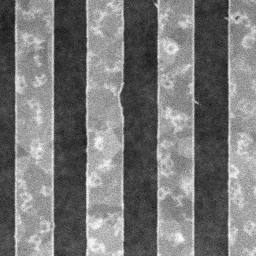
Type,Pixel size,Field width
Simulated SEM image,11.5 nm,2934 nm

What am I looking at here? one or a few lines or trenches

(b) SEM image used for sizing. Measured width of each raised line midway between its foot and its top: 35.9 px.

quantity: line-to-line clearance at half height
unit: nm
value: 403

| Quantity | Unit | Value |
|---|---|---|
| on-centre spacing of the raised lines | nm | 806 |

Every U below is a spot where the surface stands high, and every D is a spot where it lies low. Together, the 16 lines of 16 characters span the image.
DUUDDUUUDDUUDDUU
DUUDDUUUDDUUDDUU
DUUDDUUUDDUUDDUU
DUUDDUUUDDUUDDUU
DUUDDUUUDDUUDDUU
DUUDDUUUDDUUDDUU
DUUDDUUUDDUUDDUU
DUUDDUUUDDUUDDUU
DUUDDUUUDDUUDDUU
DUUDDUUUDDUUDDUU
DUUDDUUUDDUUDDUU
DUUDDUUUDDUUDDUU
DUUDDUUUDDUUDDUU
DUUDDUUUDDUUDDUU
DUUDDUUUDDUUDDUU
DUUDDDUUDDUUDDUU